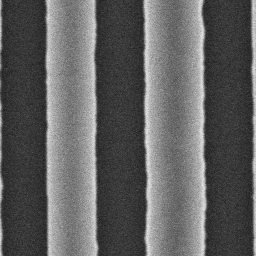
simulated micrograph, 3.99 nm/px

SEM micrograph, lines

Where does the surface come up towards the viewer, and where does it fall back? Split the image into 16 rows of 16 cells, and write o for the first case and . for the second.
...ooo...oooo...
...ooo...oooo...
...ooo...oooo...
...ooo...oooo...
...ooo...oooo...
...ooo...oooo...
...ooo...oooo...
...ooo...oooo...
...ooo...oooo...
...ooo...oooo...
...ooo...oooo...
...ooo...oooo...
...ooo...oooo...
...ooo...oooo...
...ooo...oooo...
...ooo...oooo...